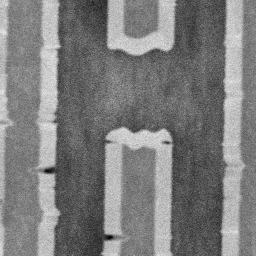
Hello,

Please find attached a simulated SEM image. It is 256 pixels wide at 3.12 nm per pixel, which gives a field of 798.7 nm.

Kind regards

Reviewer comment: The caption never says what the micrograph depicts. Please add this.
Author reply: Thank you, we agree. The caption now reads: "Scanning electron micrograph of one or a few lines or trenches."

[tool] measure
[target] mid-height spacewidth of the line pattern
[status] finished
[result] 199 nm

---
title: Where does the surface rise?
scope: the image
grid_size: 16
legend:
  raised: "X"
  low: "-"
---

XXX----XXXX----X
XXX----XXXX----X
XXX----XXX----XX
XXX-----------XX
XXX-----------XX
XXX-----------XX
XXX-----------XX
XXX-----------XX
XXX----X------XX
XXX----XXX----XX
XXX----XXX----XX
XXX----XXX----XX
XXX----XXX----XX
XXX----XXX----XX
XXX----XXX----XX
XXX----XXX----XX